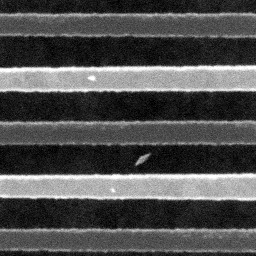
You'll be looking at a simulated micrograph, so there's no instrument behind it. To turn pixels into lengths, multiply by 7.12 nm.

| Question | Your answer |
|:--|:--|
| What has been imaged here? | lines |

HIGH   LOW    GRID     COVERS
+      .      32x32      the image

................................
................................
++++++++++++++++++++++++++++++++
++++++++++++++++++++++++++++++++
....................+...+.+.++++
................................
................................
................................
........++++++++++++++++++++++++
++++++++++++++++++++++++++++++++
++++++++++++++++++++++++++++++++
................................
................................
................................
................................
++++++++++++++++++++++++++++++++
++++++++++++++++++++++++++++++++
++++++++++++++++++++++++++++++++
................................
................................
................................
................................
++++++++++++++++++++++++++++++++
++++++++++++++++++++++++++++++++
++++++++++++++++++++++++++++++++
................................
................................
................................
................................
++++++++++++++++++++++++++++++++
++++++++++++++++++++++++++++++++
................................